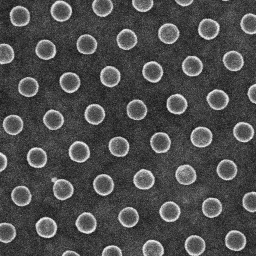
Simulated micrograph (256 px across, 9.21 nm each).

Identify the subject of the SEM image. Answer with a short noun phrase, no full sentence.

a regular array of raised bodies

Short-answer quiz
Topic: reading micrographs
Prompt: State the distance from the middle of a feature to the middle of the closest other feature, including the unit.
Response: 0.372 microns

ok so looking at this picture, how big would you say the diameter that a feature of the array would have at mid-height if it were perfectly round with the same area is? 182 nm